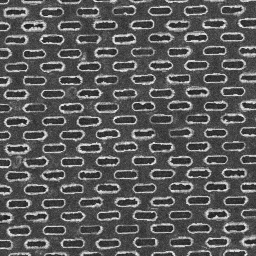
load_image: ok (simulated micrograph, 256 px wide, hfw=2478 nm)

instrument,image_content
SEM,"a regular array of holes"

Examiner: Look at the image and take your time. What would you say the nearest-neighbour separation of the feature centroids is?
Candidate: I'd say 212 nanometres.